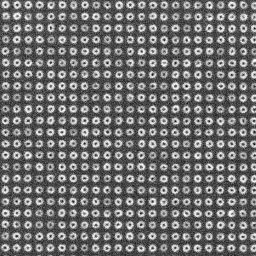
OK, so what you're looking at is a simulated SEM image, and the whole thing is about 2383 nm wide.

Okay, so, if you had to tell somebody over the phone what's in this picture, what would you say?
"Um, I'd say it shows a regular array of holes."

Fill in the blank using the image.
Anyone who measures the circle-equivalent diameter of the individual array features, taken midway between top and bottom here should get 0.0364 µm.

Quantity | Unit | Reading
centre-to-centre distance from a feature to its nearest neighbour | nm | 104